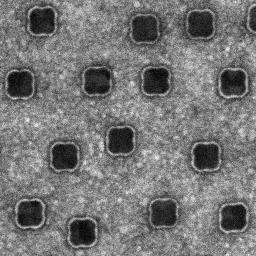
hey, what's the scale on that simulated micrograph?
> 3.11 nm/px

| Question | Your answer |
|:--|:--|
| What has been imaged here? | a regular array of raised bodies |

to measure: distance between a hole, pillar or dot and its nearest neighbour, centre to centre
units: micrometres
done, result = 0.183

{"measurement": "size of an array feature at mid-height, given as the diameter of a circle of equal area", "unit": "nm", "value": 95.2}